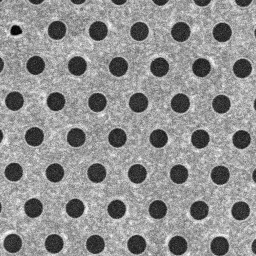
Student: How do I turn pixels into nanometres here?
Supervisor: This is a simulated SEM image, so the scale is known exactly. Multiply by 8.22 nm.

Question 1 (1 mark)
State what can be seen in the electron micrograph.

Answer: a regular array of holes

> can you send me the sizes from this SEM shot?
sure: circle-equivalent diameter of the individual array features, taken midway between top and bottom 0.162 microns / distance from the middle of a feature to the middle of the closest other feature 0.336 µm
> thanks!